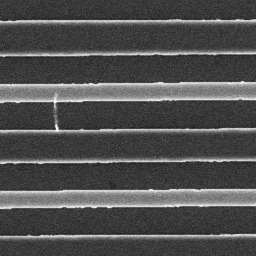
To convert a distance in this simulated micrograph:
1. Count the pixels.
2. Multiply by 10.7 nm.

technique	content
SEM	lines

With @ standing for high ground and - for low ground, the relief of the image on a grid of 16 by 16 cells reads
----------------
@@@@@@@@@@@@@@@@
@@@@@@@@@@@@@@@@
@---------------
----------------
----------------
----------------
----------------
@@@@@@@@@@@@@@@@
@@@@@@@@@@@@@@@@
----------------
----------------
----------------
----------------
----------------
@@@@@@@@@@@@@@@@